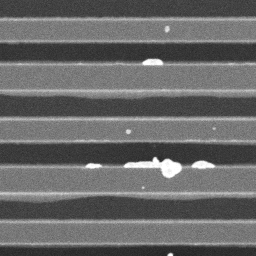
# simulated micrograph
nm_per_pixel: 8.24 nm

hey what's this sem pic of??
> lines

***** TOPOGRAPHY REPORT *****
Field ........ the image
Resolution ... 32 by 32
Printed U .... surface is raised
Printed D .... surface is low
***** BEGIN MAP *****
DDDDDDDDDDDDDDDDDDDDDDDDDDDDDDDD
DDDDDDDDDDDDDDDDDDDDDDDDDDDDDDDD
UUUUUUUUUUUUUUUUUUUUUUUUUUUUUUUU
UUUUUUUUUUUUUUUUUUUUUUUUUUUUUUUU
UUUUUUUUUUUUUUUUUUUUUUUUUUUUUUUU
DDDDDDDDDDDDDDDDDDDDDDDDDDDDDDDD
DDDDDDDDDDDDDDDDDDDDDDDDDDDDDDDD
DDDDDDDDDDDDDDDDDDUUDDDDDDDDDDDD
UUUUUUUUUUUUUUUUUUUUUUUUUUUUUUUU
UUUUUUUUUUUUUUUUUUUUUUUUUUUUUUUU
UUUUUUUUUUUUUUUUUUUUUUUUUUUUUUUU
DDDDDDDDDDDUUDDDDDDDDDDDDDDDDDDD
DDDDDDDDDDDDDDDDDDDDDDDDDDDDDDDD
DDDDDDDDDDDDDDDDDDDDDDDDDDDDDDDD
DDDDDDDDDDDDDDDDDDDDDDDDDDDDDDDD
UUUUUUUUUUUUUUUUUUUUUUUUUUUUUUUU
UUUUUUUUUUUUUUUUUUUUUUUUUUUUUUUU
UUUUUUUUUUUUUUUUUUUUUUUUUUUUUUUU
DDDDDDDDDDDDDDDDDDDDDDDDDDDDDDDD
DDDDDDDDDDDDDDDDDDDDDDDDDDDDDDDD
DDDDDDDDDDDUDDDDUUUUUUDDUUDDDDDD
UUUUUUUUUUUUUUUUUUUUUUUUUUUUUUUU
UUUUUUUUUUUUUUUUUUUUUUUUUUUUUUUU
UUUUUUUUUUUUUUUUUUUUUUUUUUUUUUUU
DDDDDDDDDDDDDDDDDDDDDDDDDDDDDDDD
DDDDDDDDDDDDDDDDDDDDDDDDDDDDDDDD
DDDDDDDDDDDDDDDDDDDDDDDDDDDDDDDD
DDDDDDDDDDDDDDDDDDDDDDDDDDDDDDDD
UUUUUUUUUUUUUUUUUUUUUUUUUUUUUUUU
UUUUUUUUUUUUUUUUUUUUUUUUUUUUUUUU
UUUUUUUUUUUUUUUUUUUUUUDUUUUUUUUU
DDDDDDDDDDDDDDDDDDDDDDDDDDDDDDDD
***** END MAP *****